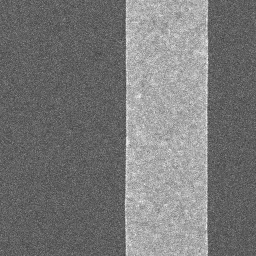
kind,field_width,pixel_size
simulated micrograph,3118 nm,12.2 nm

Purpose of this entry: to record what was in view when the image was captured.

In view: one or a few lines or trenches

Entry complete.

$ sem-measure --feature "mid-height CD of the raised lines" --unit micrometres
0.988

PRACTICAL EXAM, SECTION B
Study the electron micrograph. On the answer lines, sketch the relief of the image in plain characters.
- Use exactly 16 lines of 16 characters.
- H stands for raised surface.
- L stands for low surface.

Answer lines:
LLLLLLLLHHHHHLLL
LLLLLLLLHHHHHLLL
LLLLLLLLHHHHHLLL
LLLLLLLLHHHHHLLL
LLLLLLLLHHHHHLLL
LLLLLLLLHHHHHLLL
LLLLLLLLHHHHHLLL
LLLLLLLLHHHHHLLL
LLLLLLLLHHHHHLLL
LLLLLLLLHHHHHLLL
LLLLLLLLHHHHHLLL
LLLLLLLLHHHHHLLL
LLLLLLLLHHHHHLLL
LLLLLLLLHHHHHLLL
LLLLLLLLHHHHHLLL
LLLLLLLLHHHHHLLL